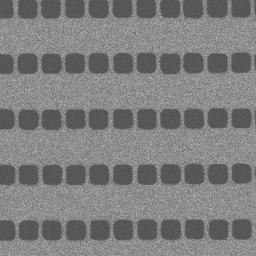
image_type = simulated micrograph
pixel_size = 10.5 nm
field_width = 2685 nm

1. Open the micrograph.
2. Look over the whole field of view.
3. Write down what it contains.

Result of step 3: a regular array of holes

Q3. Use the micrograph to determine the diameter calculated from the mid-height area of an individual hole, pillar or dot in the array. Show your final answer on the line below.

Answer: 230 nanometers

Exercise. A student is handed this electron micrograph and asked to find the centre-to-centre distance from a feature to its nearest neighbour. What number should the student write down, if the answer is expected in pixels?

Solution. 23.4